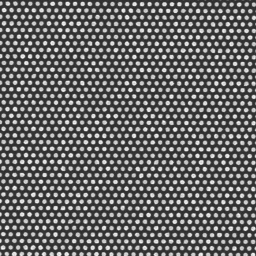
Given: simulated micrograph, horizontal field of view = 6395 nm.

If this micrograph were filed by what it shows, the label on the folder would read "a regular array of raised bodies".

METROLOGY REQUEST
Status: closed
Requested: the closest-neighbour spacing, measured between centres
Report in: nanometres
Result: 181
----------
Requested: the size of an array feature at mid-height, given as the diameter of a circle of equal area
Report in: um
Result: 0.102